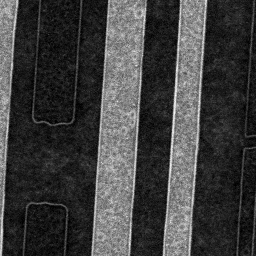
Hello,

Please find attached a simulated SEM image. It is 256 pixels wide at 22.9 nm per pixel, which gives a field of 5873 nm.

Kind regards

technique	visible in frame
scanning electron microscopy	one or a few lines or trenches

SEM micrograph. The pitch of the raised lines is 1.52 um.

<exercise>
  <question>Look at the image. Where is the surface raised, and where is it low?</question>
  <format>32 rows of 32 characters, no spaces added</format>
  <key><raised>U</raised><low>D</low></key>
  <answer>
UUDDDUUUUUDDDDUUUUDDDDDUUUDDDDDD
UUDDDUUUUUDDDDUUUUDDDDDUUUDDDDDD
UUDDDUUUUUDDDUUUUUDDDDDUUUDDDDDD
UUDDDUUUUUDDDUUUUUDDDDUUUDDDDDDD
UUDDDUUUUUDDDUUUUUDDDDUUUDDDDDDD
UUDDDUUUUUDDDUUUUUDDDDUUUDDDDDDU
UUDDDUUUUUDDDUUUUUDDDDUUUDDDDDDU
UDDDDUUUUUDDDUUUUUDDDDUUUDDDDDDU
UDDDDUUUUUDDDUUUUUDDDDUUUDDDDDDU
UDDDUUUUUDDDDUUUUUDDDDUUUDDDDDDU
UDDDUUUUUDDDDUUUUUDDDDUUUDDDDDDU
UDDDUUUUUDDDDUUUUDDDDDUUUDDDDDDU
UDDDUUUUUDDDDUUUUDDDDDUUUDDDDDDU
UDDDUUUUUDDDDUUUUDDDDDUUUDDDDDDU
UDDDUUUUUDDDDUUUUDDDDDUUUDDDDDDU
UDDDDDUDDDDDDUUUUDDDDDUUUDDDDDDU
UDDDDDDDDDDDDUUUUDDDDDUUUDDDDDDU
UDDDDDDDDDDDDUUUUDDDDDUUUDDDDDDD
UDDDDDDDDDDDUUUUUDDDDUUUUDDDDDDD
UDDDDDDDDDDDUUUUUDDDDUUUUDDDDDUU
UDDDDDDDDDDDUUUUUDDDDUUUDDDDDDUU
UDDDDDDDDDDDUUUUUDDDDUUUDDDDDDUU
DDDDDDDDDDDDUUUUUDDDDUUUDDDDDDUU
DDDDDDDDDDDDUUUUUDDDDUUUDDDDDDUU
DDDDDDDDDDDDUUUUUDDDDUUUDDDDDDUU
DDDDUUDDDDDDUUUUUDDDDUUUDDDDDDUU
DDDUUUUUDDDDUUUUDDDDDUUUDDDDDDUU
DDDUUUUUDDDDUUUUDDDDDUUUDDDDDDUU
DDDUUUUUDDDDUUUUDDDDDUUUDDDDDDUU
DDDUUUUUDDDDUUUUDDDDDUUUDDDDDDUU
DDDUUUUUDDDDUUUUDDDDDUUUDDDDDDUU
DDDUUUUUDDDDUUUUDDDDUUUUDDDDDDUD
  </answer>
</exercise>